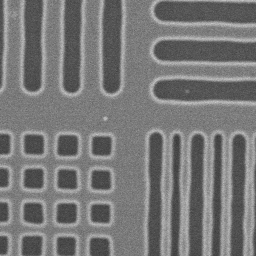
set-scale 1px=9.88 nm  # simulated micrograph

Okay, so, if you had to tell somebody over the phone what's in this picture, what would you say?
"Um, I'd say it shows groups of lines, slits or small figures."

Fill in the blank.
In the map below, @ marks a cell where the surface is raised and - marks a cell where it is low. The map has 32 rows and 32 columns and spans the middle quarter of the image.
----@@@@@-----@@@@@@@@@@@@@@@@@@
----@@@@@-----@@@@@@@@@@@@@@@@@@
----@@@@@-----@@@@@@@@@@@@@@@@@@
----@@@@@-----@@@@@@@@@@@@@@-@@@
----@@@@@-----@@@@@@@@@---------
----@@@@@@----@@@@@@@@----------
----@@@@@@----@@@@@@@@----------
@@@@@@@@@@@-@@@@@@@@@@----------
@@@@@@@@@@@@@@@@@@@@@@@---------
@@@@@@@@@@@@@@@@@@@@@@@@@@@@----
@@@@@@@@@@@@@@@@@@@@@@@@@@@@@@@@
@@@@@@@@@@@@@@@@@@@@@@@@@@@@@@@@
@@@@@@@@@@@@@@@@@@@@@@@@@@@@@@@@
@@@@@@@@@@@@@@@@@@@@@@@@@@@@@@@@
@@@@@@@@@@@@@@@@@@@@@@@@@@@@@@@@
@@@@@@@@@@@@@@@@@@@@@@@@@@@@@@@@
@@@@@@@@@@@@@@@@@@@@@@@@@@@@@@@@
--@@@@@@@@@@@@@@@@@@@@--@@@@-@@@
----@@@-----@@@@@@@@@----@@--@@@
----@@@-----@@@@@@@@@----@@--@@@
----@@@-----@@@@@@@@@----@@--@@@
----@@@-----@@@@@@@@@----@@--@@@
---@@@@-----@@@@@@@@@----@@--@@-
@@@@@@@@@@@@@@@@@@@@@----@@--@@-
@@@@@@@@@@@@@@@@@@@@@----@@--@@-
@@@@@@@@@@@@@@@@@@@@@----@@--@@-
---@@@@----@@@@@@@@@@----@@--@@-
---@@@@-----@@@@@@@@@----@@--@@-
---@@@@-----@@@@@@@@@---@@@--@@-
---@@@@-----@@@@@@@@@---@@@--@@-
---@@@@-----@@@@@@@@@---@@@--@@-
---@@@@-----@@@@@@@@@---@@@--@@-